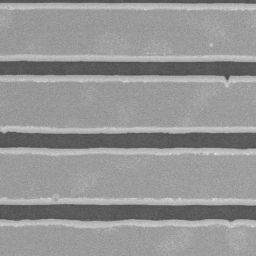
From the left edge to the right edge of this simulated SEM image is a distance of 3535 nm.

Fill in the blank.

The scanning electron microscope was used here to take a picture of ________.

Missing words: one or a few lines or trenches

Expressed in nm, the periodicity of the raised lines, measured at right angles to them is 996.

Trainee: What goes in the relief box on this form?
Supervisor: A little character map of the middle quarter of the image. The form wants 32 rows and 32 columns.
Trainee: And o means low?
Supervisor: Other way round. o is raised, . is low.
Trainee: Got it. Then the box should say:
................................
................................
................................
ooooooooooo.....................
oooooooooooooooooooooooooooooooo
oooooooooooooooooooooooooooooooo
oooooooooooooooooooooooooooooooo
oooooooooooooooooooooooooooooooo
oooooooooooooooooooooooooooooooo
oooooooooooooooooooooooooooooooo
oooooooooooooooooooooooooooooooo
oooooooooooooooooooooooooooooooo
oooooooooooooooooooooooooooooooo
oooooooooooooooooooooooooooooooo
oooooooooooooooooooooooooooooooo
oooooooooooooooooooooooooooooooo
ooooooooooooooooo....ooooooooooo
................................
................................
................................
................................
................................
oooooooooooooooooooooooooooooooo
oooooooooooooooooooooooooooooooo
oooooooooooooooooooooooooooooooo
oooooooooooooooooooooooooooooooo
oooooooooooooooooooooooooooooooo
oooooooooooooooooooooooooooooooo
oooooooooooooooooooooooooooooooo
oooooooooooooooooooooooooooooooo
oooooooooooooooooooooooooooooooo
oooooooooooooooooooooooooooooooo